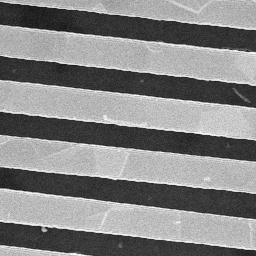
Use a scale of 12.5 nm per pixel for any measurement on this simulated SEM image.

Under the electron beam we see lines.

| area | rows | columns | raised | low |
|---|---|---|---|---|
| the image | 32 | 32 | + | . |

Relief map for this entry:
..++++++++++++++++++++++++++++++
............++++++++++++++++++++
....................++++++++++++
+++..........................+++
++++++++++++....................
+++++++++++++++++++++...........
++++++++++++++++++++++++++++++..
....++++++++++++++++++++++++++++
.............+++++++++++++++++++
......................++++++++++
++++...........................+
+++++++++++++...................
++++++++++++++++++++++..........
+++++++++++++++++++++++++++++++.
.....+++++++++++++++++++++++++++
..............++++++++++++++++++
.......................+++++++++
+++++...........................
+++++++++++++++.................
++++++++++++++++++++++++........
++++++++++++++++++++++++++++++++
.....+++++++++++++++++++++++++++
................++++++++++++++++
.........................+++++++
+++++++.........................
+++++++++++++++.................
++++++++++++++++++++++++........
++++++++++++++++++++++++++++++++
.......+++++++++++++++++++++++++
................++++++++++++++++
.........................+++++++
+++++++.........................